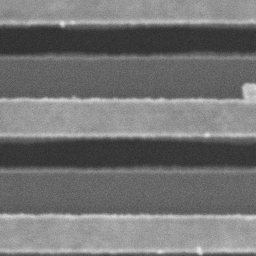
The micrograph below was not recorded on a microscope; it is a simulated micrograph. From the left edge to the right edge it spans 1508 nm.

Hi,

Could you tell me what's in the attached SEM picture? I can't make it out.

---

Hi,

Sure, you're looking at lines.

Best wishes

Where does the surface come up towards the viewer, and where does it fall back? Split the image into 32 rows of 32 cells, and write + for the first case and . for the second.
++++++++++++++++++++++++++++++++
++++++++++++++++++++++++++++++++
++++++++++++++++++++++++++++++++
................................
................................
................................
................................
++++++++++++++++++++++++++++++++
++++++++++++++++++++++++++++++++
++++++++++++++++++++++++++++++++
++++++++++++++++++++++++++++++++
++++++++++++++++++++++++++++++++
++++++++++++++++++++++++++++++++
++++++++++++++++++++++++++++++++
++++++++++++++++++++++++++++++++
++++++++++++++++++++++++++++++++
++++++++++++++++++++++++++++++++
................................
................................
................................
................................
++++++++++++++++++++++++++++++++
++++++++++++++++++++++++++++++++
++++++++++++++++++++++++++++++++
++++++++++++++++++++++++++++++++
++++++++++++++++++++++++++++++++
++++++++++++++++++++++++++++++++
++++++++++++++++++++++++++++++++
++++++++++++++++++++++++++++++++
++++++++++++++++++++++++++++++++
++++++++++++++++++++++++++++++++
++++++++++++++++++++++++++++++++